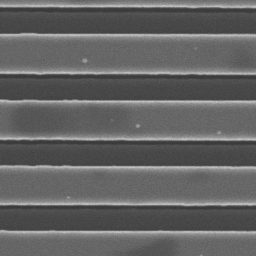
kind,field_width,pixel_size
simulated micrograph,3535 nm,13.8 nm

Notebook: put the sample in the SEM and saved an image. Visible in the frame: lines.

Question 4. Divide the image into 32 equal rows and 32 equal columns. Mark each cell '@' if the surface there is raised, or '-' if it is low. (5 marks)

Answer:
@@@@@@@@@@@@@@@@@@@@@@@@@@@@@@@@
--------------------------------
--------------------------------
--------------------------------
@@@@@@@@@@@@@@@@@@@@@@@@@@@@@@@@
@@@@@@@@@@@@@@@@@@@@@@@@@@@@@@@@
@@@@@@@@@@@@@@@@@@@@@@@@@@@@@@@@
@@@@@@@@@@@@@@@@@@@@@@@@@@@@@@@@
@@@@@@@@@@@@@@@@@@@@@@@@@@@@@@@@
--------------------------------
--------------------------------
--------------------------------
--------------------------------
@@@@@@@@@@@@@@@@@@@@@@@@@@@@@@@@
@@@@@@@@@@@@@@@@@@@@@@@@@@@@@@@@
@@@@@@@@@@@@@@@@@@@@@@@@@@@@@@@@
@@@@@@@@@@@@@@@@@@@@@@@@@@@@@@@@
--------------------------------
--------------------------------
--------------------------------
--------------------------------
@@@@@@@@@@@@@@@@@@@@@@@@@@@@@@@@
@@@@@@@@@@@@@@@@@@@@@@@@@@@@@@@@
@@@@@@@@@@@@@@@@@@@@@@@@@@@@@@@@
@@@@@@@@@@@@@@@@@@@@@@@@@@@@@@@@
@@@@@@@@@@@@@@@@@@@@@@@@@@@@@@@@
--------------------------------
--------------------------------
--------------------------------
@@@@@@@@@@@@@@@@@@@@@@@@@@@@@@@@
@@@@@@@@@@@@@@@@@@@@@@@@@@@@@@@@
@@@@@@@@@@@@@@@@@@@@@@@@@@@@@@@@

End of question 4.